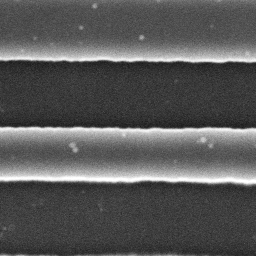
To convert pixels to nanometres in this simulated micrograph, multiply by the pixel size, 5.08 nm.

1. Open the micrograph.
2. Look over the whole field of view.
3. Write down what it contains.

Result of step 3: lines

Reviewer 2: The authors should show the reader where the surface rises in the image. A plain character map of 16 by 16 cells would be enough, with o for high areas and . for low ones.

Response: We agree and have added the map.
oooooooooooooooo
oooooooooooooooo
oooooooooooooooo
oooooooooooooooo
................
................
................
................
oooooooooooooooo
oooooooooooooooo
oooooooooooooooo
................
................
................
................
................